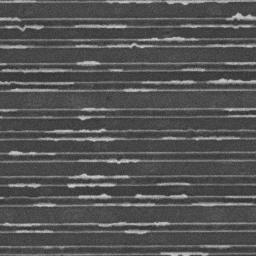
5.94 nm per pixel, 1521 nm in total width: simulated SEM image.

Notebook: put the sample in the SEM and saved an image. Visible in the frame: parallel lines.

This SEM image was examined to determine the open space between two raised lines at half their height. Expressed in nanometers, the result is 82.4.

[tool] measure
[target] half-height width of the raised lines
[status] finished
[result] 53.4 nanometres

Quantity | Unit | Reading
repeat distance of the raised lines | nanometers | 135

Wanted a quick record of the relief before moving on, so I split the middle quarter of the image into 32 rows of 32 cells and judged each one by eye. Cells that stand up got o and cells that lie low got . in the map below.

oooooooooooooooooooooooooooooooo
oooooooooooooooooooooooooooooooo
................................
................................
.....................o....oooooo
oooooooooooooooooooooooooooooooo
oooooooooooooooooooooooooooooooo
................................
................................
................................
................................
oooooooooooooooooooooooooooooooo
oooooooooooooooooooooooooooooooo
...oooo.........................
................................
................................
....o....oo.............oooooo.o
oooooooooooooooooooooooooooooooo
oooooooooooooooooooooooooooooooo
................................
................................
................................
oooooooooooooooooooooooooooooooo
oooooooooooooooooooooooooooooooo
.......o..oooooo................
................................
................................
................................
oooooooooooooooooooooooooooooooo
oooooooooooooooooooooooooooooooo
oooooooooooo....................
................................